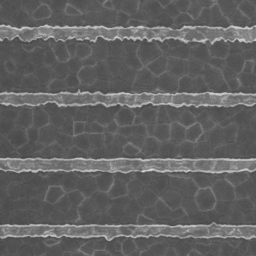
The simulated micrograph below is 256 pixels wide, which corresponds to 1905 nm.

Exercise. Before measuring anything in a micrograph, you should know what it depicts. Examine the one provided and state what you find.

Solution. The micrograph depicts one or a few lines or trenches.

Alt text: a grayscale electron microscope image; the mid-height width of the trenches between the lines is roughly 403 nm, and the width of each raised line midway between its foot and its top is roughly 83.7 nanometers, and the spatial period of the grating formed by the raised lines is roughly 490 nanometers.